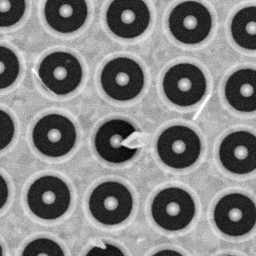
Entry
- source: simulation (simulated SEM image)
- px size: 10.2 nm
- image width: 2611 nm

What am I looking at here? an array of small figures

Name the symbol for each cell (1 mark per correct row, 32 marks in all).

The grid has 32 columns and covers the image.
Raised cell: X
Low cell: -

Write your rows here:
----X------XX------XXX----XXXXX-
---XX------XX------XX------XX---
---XX------XX------XX------XX---
--XXXX----XXX------XX------XX---
XXXXXXXXXXXXXX----XXX-----XXX---
-XXXXXXXXXXXXXXXXXXXXX---XXXX---
--XXXX---XXXXXXXXXXXXXXXXXXXXXX-
---XX-----XXX----XXXXXXXXXXXXXXX
---XX------XX-----XXX----XXXXX--
---XX------X------XX------XX----
--XXX-----XX------XX------XX----
XXXXXX----XXX-----XX------XX----
XXXXXXXXXXXXXX---XXXX----XXX----
-XXXXXXXXXXXXXXXXXXXXX--XXXXX---
--XXX----XXXXXXXXXXXXXXXXXXXXXXX
--XX------XX-----XXXX---XXXXXXXX
--XX------XX-----XXX-----XXX----
--XX------XX----XXX------XX-----
-XXX-----XXX----XXX------XX-----
XXXXX----XXX-----XX------XX-----
XXXXXXXXXXXXX---XXXX-----XX-----
XXXXXXXXXXXXXXXXXXXXXXXXXXXX----
-XXX----XXXXX--XXXXXXXXXXXXXXXXX
-XX------XX-----XXXX---XXXXXXXXX
-XX------XX------XX-----XXX----X
-XX------XX------XX------XX-----
XXXX-----XX------XX------X------
XXXXX--XXXXX----XXX-----XX------
XXXXXXXXXXXXXXXXXXXX----XXX-----
XXXXX-XXXXXXXXXXXXXXXXXXXXXX---X
XXX-----XXXXX--XXXXXXXXXXXXXXXXX
-X------XXX-----XXX----XXXXXXXXX